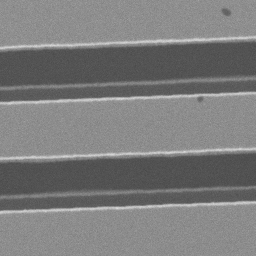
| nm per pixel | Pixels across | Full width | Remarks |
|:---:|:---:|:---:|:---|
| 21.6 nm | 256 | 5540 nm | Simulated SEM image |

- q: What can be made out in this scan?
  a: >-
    lines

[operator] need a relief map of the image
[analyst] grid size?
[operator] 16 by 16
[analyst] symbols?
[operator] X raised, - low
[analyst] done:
XXXXXXXXXXXXXXXX
XXXXXXXXXXXXXXXX
XXXXXXXXXXXXXX--
----------------
----------------
----------------
XXXXXXXXXXXXXXXX
XXXXXXXXXXXXXXXX
XXXXXXXXXXXXXXXX
XXXXXXXXXXXX----
----------------
----------------
----------------
XXXXXXXXXXXXXXXX
XXXXXXXXXXXXXXXX
XXXXXXXXXXXXXXXX